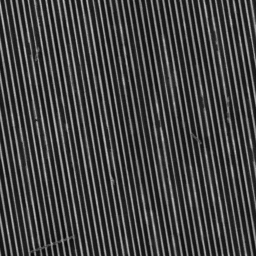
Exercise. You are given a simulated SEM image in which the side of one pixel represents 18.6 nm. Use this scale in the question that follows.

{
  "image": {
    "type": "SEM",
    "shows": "parallel lines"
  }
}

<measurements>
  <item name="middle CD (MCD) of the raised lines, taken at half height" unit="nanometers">32.1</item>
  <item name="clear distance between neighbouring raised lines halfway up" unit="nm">80.1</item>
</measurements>